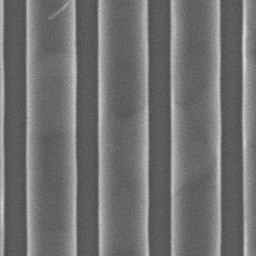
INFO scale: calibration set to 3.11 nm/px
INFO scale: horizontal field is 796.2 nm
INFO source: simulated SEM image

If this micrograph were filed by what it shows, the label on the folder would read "wiring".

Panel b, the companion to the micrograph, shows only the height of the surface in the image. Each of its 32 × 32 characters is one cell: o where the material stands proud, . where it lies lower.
...oooooo...oooooo...oooooo...oo
...oooooo...oooooo...oooooo....o
...oooooo...oooooo...oooooo...oo
...oooooo...oooooo...oooooo...oo
...oooooo...oooooo...oooooo...oo
...oooooo...oooooo...oooooo...o.
...oooooo...oooooo...oooooo...o.
...oooooo...oooooo...oooooo...oo
...oooooo...oooooo...oooooo...oo
...oooooo...oooooo...oooooo...oo
...oooooo...oooooo...oooooo...oo
...oooooo...oooooo...oooooo...oo
...oooooo...oooooo...oooooo...oo
...oooooo...oooooo...oooooo...oo
...oooooo...oooooo...ooooooo..oo
...oooooo...oooooo...ooooooo..oo
...oooooo...ooooooo..ooooooo..oo
...oooooo...ooooooo..ooooooo..oo
...oooooo...ooooooo..oooooo...oo
...oooooo...ooooooo..oooooo....o
...oooooo...oooooo...ooooooo...o
...oooooo...oooooo...ooooooo...o
...oooooo...oooooo...ooooooo...o
...oooooo...oooooo...ooooooo...o
...oooooo...ooooooo..ooooooo...o
...oooooo...ooooooo..ooooooo...o
...oooooo...oooooo...ooooooo...o
...oooooo...oooooo...ooooooo...o
....ooooo...oooooo...ooooooo...o
....ooooo...oooooo...ooooooo...o
....ooooo...ooooooo..oooooo....o
....ooooo...ooooooo..oooooo....o